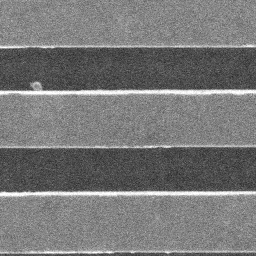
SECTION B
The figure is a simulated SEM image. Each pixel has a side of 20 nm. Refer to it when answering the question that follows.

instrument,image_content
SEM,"lines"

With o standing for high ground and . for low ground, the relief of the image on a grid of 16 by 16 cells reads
oooooooooooooooo
oooooooooooooooo
oooooooooooooooo
................
................
................
oooooooooooooooo
oooooooooooooooo
oooooooooooooooo
................
................
................
oooooooooooooooo
oooooooooooooooo
oooooooooooooooo
oooooooooooooooo